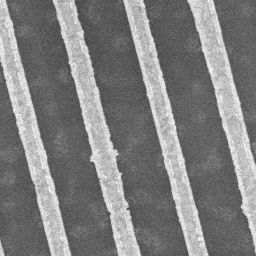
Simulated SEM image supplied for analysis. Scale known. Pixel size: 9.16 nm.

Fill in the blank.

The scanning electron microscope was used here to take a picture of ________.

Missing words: one or a few lines or trenches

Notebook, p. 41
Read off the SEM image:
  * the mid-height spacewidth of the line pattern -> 456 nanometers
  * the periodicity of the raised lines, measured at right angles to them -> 609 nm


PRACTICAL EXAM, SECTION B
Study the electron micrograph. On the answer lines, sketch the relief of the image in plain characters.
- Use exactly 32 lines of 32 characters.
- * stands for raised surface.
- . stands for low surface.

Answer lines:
*......**.......**......***.....
*......**.......**......***.....
*.......**......**.......**.....
*.......**.......*.......**.....
**......**.......**......***....
**......***......**......***....
**.......**......**.......**....
**.......**.......**......**....
.**......**.......**......**....
.**......***......**.......**...
.**.......**......**.......**...
.**.......**.......**......**...
..**......**.......**......***..
..**......***......**.......**..
..**.......**......**.......**..
..**.......**.......**......**..
...**......**.......**......***.
...**......***......**.......**.
...**.......**......**.......**.
...**.......**.......**......**.
....**......**.......**......***
....**......***......**.......**
....**.......**......**.......**
.....**......**.......**......**
.....**......**.......**......**
.....**......***......**.......*
.....**.......**......**.......*
......**......**.......**......*
......**......**.......**......*
......**......***......**.......
......**.......**......**.......
......**.......**.......**......